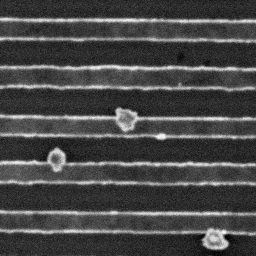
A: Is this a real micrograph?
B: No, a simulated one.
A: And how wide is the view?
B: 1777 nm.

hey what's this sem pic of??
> lines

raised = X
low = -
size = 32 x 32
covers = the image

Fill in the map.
--------------------------------
--------------------------------
XXXXXXXXXXXXXXXXXX-X------------
XXXXXXXXXXXXXXXXXXXXXXXXXXXXXXXX
XXXXXXXXXXXXXXXXXXXXXXXXXXXXXXXX
--------------------------------
--------------------------------
--------------------------------
XXXXXXXXX-XXXXXXXX--XXXX-X------
XXXXXXXXXXXXXXXXXXXXXXXXXXXXXXXX
XXXXXXXXXXXXXXXXXXXXXXXXXXXXXXXX
--------------------------------
--------------------------------
--------------------------------
--------------XXX---------------
XXXXXXXXXXXXXXXXXXXXXXXXXXXXXXXX
XXXXXXXXXXXXXXXXXXXXXXXXXXXXXXXX
--------------------------------
--------------------------------
------XX------------------------
XXXXXXXXXXXXXXXXXXXXXXXXXXXXX--X
XXXXXXXXXXXXXXXXXXXXXXXXXXXXXXXX
XXXXXXXXXXXXXXXXXXXXXXXXXXXXXXXX
--------------------------------
--------------------------------
--------------------------------
X-------------------------------
XXXXXXXXXXXXXXXXXXXXXXXXXXXXXXXX
XXXXXXXXXXXXXXXXXXXXXXXXXXXXXXXX
--------------------------XX----
--------------------------XX----
--------------------------------